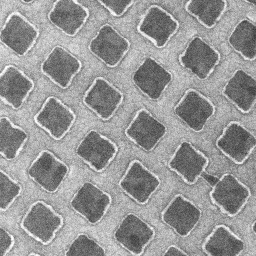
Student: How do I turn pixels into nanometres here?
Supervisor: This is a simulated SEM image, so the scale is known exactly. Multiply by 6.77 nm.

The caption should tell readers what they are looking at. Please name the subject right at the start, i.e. a regular array of raised bodies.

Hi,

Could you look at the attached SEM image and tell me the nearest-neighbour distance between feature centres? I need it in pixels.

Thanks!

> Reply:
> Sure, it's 52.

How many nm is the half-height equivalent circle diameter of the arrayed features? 250